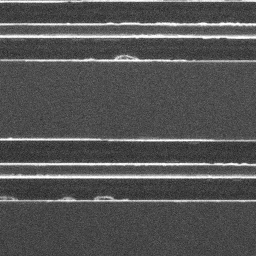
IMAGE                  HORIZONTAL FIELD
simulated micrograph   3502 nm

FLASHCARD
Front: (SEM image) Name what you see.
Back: lines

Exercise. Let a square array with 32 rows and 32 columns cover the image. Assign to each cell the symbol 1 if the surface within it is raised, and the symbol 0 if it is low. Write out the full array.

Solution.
00000000000000000000000000000000
00000000000000000000000000000000
00000000000000000000000000000000
11111111111111111111111111111111
11111111111111111111111111111111
00000000000000000000000000000000
00000000000000000000000000000000
00000000000000000000000000000000
11111111111111111111111111111111
11111111111111111111111111111111
11111111111111111111111111111111
11111111111111111111111111111111
11111111111111111111111111111111
11111111111111111111111111111111
11111111111111111111111111111111
11111111111111111111111111111111
11111111111111111111111111111111
00000000000000000000011111111111
00000000000000000000000000000000
00000000000000000000000000000000
11111111111111011110111000000000
11111111111111111111111111111111
00000000000000000000000000000000
00000000000000000000000000000000
00000000000000000000000000000000
11111111111111111111111111111111
11111111111111111111111111111111
11111111111111111111111111111111
11111111111111111111111111111111
11111111111111111111111111111111
11111111111111111111111111111111
11111111111111111111111111111111